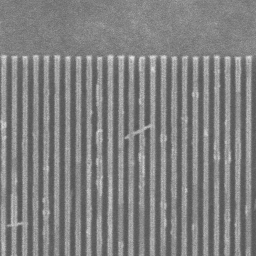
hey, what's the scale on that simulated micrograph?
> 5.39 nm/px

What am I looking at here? parallel lines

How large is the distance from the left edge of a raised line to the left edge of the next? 0.0575 um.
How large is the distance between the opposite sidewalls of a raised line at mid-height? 4.88 px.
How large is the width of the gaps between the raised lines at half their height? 31.7 nanometers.